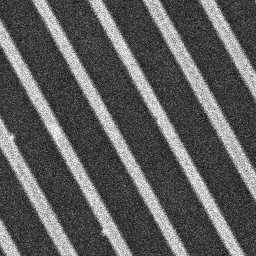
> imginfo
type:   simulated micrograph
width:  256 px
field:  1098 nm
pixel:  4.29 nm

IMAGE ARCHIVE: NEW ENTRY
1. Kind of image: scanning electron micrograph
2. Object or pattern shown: parallel lines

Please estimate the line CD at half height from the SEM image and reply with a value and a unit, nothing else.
0.0501 microns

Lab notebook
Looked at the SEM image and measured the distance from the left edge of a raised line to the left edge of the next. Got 210 nm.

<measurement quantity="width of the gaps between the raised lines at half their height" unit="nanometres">160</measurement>